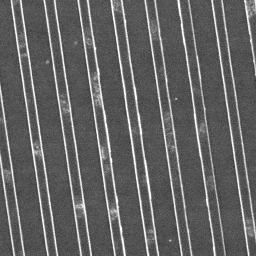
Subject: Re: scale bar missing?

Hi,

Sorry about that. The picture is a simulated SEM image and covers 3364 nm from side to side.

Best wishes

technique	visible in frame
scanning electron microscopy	parallel lines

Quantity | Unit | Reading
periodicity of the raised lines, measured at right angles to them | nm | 435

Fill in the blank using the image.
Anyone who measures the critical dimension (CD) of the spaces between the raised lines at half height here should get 0.301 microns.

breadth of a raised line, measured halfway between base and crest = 138 nanometres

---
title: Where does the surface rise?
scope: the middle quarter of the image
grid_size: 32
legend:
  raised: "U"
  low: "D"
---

DDDDDDUUDDDDDDUUUDDDDDDUUDDDDDDU
DDDDDDUUDDDDDDUUUDDDDDDUUDDDDDDU
DDDDDDUUUDDDDDDUUDDDDDDUUDDDDDDU
DDDDDDUUUDDDDDDUUDDDDDDUUDDDDDDU
UDDDDDUUUDDDDDDUUDDDDDDUUUDDDDDD
UDDDDDDUUDDDDDDUUUDDDDDUUUDDDDDD
UDDDDDDUUDDDDDDUUUDDDDDDUUDDDDDD
UDDDDDDUUDDDDDDUUUDDDDDDUUDDDDDD
UDDDDDDUUDDDDDDUUUDDDDDDUUDDDDDD
UDDDDDDUUUDDDDDDUUDDDDDDUUDDDDDD
UUDDDDDUUUDDDDDDUUDDDDDDUUDDDDDD
UUDDDDDDUUDDDDDDUUDDDDDDUUUDDDDD
UUDDDDDDUUDDDDDDUUUDDDDDUUUDDDDD
UUDDDDDDUUDDDDDDUUUDDDDDDUUDDDDD
UUDDDDDDUUDDDDDDUUUDDDDDDUUDDDDD
UUDDDDDDUUDDDDDDUUUDDDDDDUUDDDDD
UUDDDDDDUUUDDDDDDUUDDDDDDUUDDDDD
UUUDDDDDUUUDDDDDDUUDDDDDDUUDDDDD
UUUDDDDDUUUDDDDDDUUDDDDDDUUUDDDD
UUUDDDDDDUUDDDDDDUUUDDDDDUUUDDDD
UUUDDDDDDUUDDDDDDUUUDDDDDDUUDDDD
DUUDDDDDDUUDDDDDDUUUDDDDDDUUDDDD
DUUDDDDDDUUDDDDDDUUUDDDDDDUUDDDD
DUUDDDDDDUUUDDDDDDUUDDDDDDUUDDDD
DUUUDDDDDUUUDDDDDDUUDDDDDDUUUDDD
DUUUDDDDDUUUDDDDDDUUDDDDDDUUUDDD
DUUUDDDDDDUUDDDDDDUUUDDDDDUUUDDD
DUUUDDDDDDUUDDDDDDUUUDDDDDUUUDDD
DDUUDDDDDDUUDDDDDDUUUDDDDDDUUDDD
DDUUDDDDDDUUUDDDDDUUUDDDDDDUUDDD
DDUUDDDDDDUUUDDDDDDUUDDDDDDUUDDD
DDUUUDDDDDUUUDDDDDDUUDDDDDDUUUDD